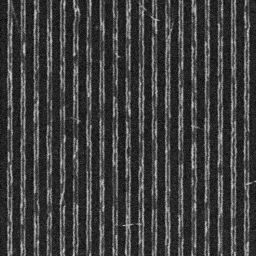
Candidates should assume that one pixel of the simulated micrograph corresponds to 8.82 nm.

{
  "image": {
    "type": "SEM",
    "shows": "parallel lines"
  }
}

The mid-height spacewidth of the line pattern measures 79.3 nanometres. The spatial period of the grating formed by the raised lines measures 116 nanometers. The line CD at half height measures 0.0397 um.